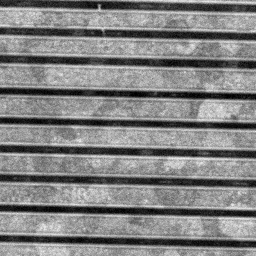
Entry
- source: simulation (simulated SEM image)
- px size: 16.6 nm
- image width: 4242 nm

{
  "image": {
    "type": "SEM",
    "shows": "parallel lines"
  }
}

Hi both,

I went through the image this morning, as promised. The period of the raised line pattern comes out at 0.488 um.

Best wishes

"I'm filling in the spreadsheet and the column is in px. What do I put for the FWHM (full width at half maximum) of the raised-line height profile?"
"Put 20.6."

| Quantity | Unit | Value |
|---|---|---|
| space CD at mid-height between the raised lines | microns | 0.147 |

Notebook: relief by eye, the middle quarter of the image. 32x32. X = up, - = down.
XX------------------------------
XXXXXXXXXXXXXXXXXXXXXXXXXXXXXXXX
XXXXXXXXXXXXXXXXXXXXXXXXXXXXXXXX
XXXXXXXXXXXXXXXXXXXXXXXXXXXXXXXX
XXXXXXXXXXXXXXXXXXXXXXXXXXXXXXXX
XXXXXXXXXXXXXXXXXXXXXXXXXXXXXXXX
----------------------------XXXX
--------------------------------
XXXXXXXXX-----------------------
XXXXXXXXXXXXXXXXXXXXXXXXXXXXXXXX
XXXXXXXXXXXXXXXXXXXXXXXXXXXXXXXX
XXXXXXXXXXXXXXXXXXXXXXXXXXXXXXXX
XXXXXXXXXXXXXXXXXXXXXXXXXXXXXXXX
------------XXXXXXXXXXXXXXXXXXXX
--------------------------------
--------------------------------
XXXXXXXXXXXXXXXXXXXXXXXXXXXXXXXX
XXXXXXXXXXXXXXXXXXXXXXXXXXXXXXXX
XXXXXXXXXXXXXXXXXXXXXXXXXXXXXXXX
XXXXXXXXXXXXXXXXXXXXXXXXXXXXXXXX
----------XXXXXXXXXXXXXXXXXXXXXX
--------------------------------
--------------------------------
XXXXXXXXXXXXXXXXXXXXXXXXXXXXXXXX
XXXXXXXXXXXXXXXXXXXXXXXXXXXXXXXX
XXXXXXXXXXXXXXXXXXXXXXXXXXXXXXXX
XXXXXXXXXXXXXXXXXXXXXXXXXXXXXXXX
XXXXXXXXXXXXXXXXXXXXXXXXXXXXXXXX
--------------------------------
--------------------------------
XXXXXXXXXXXXXXXX----------------
XXXXXXXXXXXXXXXXXXXXXXXXXXXXXXXX